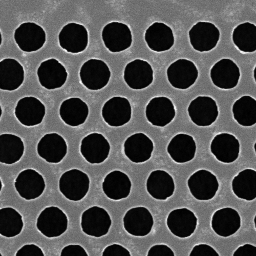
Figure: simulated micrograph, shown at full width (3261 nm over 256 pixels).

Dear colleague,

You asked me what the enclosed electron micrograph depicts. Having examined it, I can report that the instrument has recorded a regular array of holes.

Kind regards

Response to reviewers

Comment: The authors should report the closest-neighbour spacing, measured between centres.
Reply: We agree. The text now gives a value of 0.541 µm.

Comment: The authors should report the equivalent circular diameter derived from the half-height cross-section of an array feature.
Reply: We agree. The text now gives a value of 29.6 pixels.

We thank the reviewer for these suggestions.